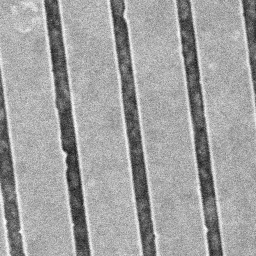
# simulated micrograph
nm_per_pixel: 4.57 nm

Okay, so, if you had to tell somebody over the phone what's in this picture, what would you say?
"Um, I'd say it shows one or a few lines or trenches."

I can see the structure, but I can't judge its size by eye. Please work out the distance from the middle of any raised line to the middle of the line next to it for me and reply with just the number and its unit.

0.3 micrometres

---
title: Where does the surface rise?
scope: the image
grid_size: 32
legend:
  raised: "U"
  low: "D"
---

UUUUUDDUUUUUUUDDUUUUUUDDUUUUUUDD
UUUUUUDDUUUUUUDDUUUUUUDDUUUUUUDD
UUUUUUDDUUUUUUDDUUUUUUDDUUUUUUDD
UUUUUUDDUUUUUUDDUUUUUUDDUUUUUUUD
UUUUUUDDUUUUUUDDUUUUUUDDUUUUUUUD
UUUUUUDDUUUUUUDDUUUUUUUDDUUUUUUD
UUUUUUDDUUUUUUDDUUUUUUUDDUUUUUUD
UUUUUUDDUUUUUUUDDUUUUUUDDUUUUUUD
UUUUUUDDUUUUUUUDDUUUUUUDDUUUUUUD
UUUUUUUDDUUUUUUDDUUUUUUDDUUUUUUD
UUUUUUUDDUUUUUUDDUUUUUUDDUUUUUUD
UUUUUUUDDUUUUUUDDUUUUUUDDUUUUUUU
DUUUUUUDDUUUUUUDDUUUUUUDDDUUUUUU
DUUUUUUDDUUUUUUDDUUUUUUUDDUUUUUU
DUUUUUUDDUUUUUUDDUUUUUUUDDUUUUUU
DUUUUUUDDUUUUUUUDDUUUUUUDDUUUUUU
DUUUUUUUDDUUUUUUDDUUUUUUDDUUUUUU
DUUUUUUUDDUUUUUUDDUUUUUUDDUUUUUU
DUUUUUUUDDUUUUUUDDUUUUUUDDUUUUUU
DDUUUUUUDDUUUUUUDDUUUUUUDDUUUUUU
DDUUUUUUDDUUUUUUDDUUUUUUDDUUUUUU
DDUUUUUUDDUUUUUUDDUUUUUUUDDUUUUU
DDUUUUUUDDUUUUUUDDUUUUUUUDDUUUUU
DDUUUUUUDDUUUUUUUDDUUUUUUDDUUUUU
DDUUUUUUDDDUUUUUUDDUUUUUUDDUUUUU
DDUUUUUUUDDUUUUUUDDUUUUUUDDUUUUU
DDUUUUUUUDDUUUUUUDDUUUUUUDDUUUUU
UDDUUUUUUDDUUUUUUDDUUUUUUDDUUUUU
UDDUUUUUUDDUUUUUUDDUUUUUUUDDUUUU
UDDUUUUUUDDUUUUUUDDUUUUUUUDDUUUU
UDDUUUUUUDDUUUUUUUDUUUUUUUDDUUUU
UDDUUUUUUDDUUUUUUUDDUUUUUUDDUUUU